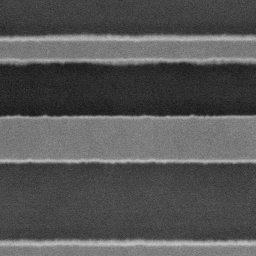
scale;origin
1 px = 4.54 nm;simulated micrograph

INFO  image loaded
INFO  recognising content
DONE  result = lines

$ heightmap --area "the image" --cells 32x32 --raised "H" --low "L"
LLLLLLLLLLLLLLLLLLLLLLLLLLLLLLLL
LLLLLLLLLLLLLLLLLLLLLLLLLLLLLLLL
LLLLLLLLLLLLLLLLLLLLLLLLLLLLLLLL
LLLLLLLLLLLLLLLLLLLLLLLLLLLLLLLL
LLLLLLLLLLLLLLLLLLLLLLLLLLLLLLLL
HHHHHHHHHHHHHHHHHHHHHHHHHHHHHHHH
HHHHHHHHHHHHHHHHHHHHHHHHHHHHHHHH
HHHHLHHHHLHHHHHHLLLLHHHLHHLLLLLH
LLLLLLLLLLLLLLLLLLLLLLLLLLLLLLLL
LLLLLLLLLLLLLLLLLLLLLLLLLLLLLLLL
LLLLLLLLLLLLLLLLLLLLLLLLLLLLLLLL
LLLLLLLLLLLLLLLLLLLLLLLLLLLLLLLL
LLLLLLLLLLLLLLLLLLLLLLLLLLLLLLLL
LLLLLLLLLLLLLLLLLLLLLLLLLLLLLLLL
LLLLLLLLLLLLLLLLLLLLLLLLLLLLLLLL
HHHHHHHHHHHHHHHHHHHHHHHHHHHHHHHH
HHHHHHHHHHHHHHHHHHHHHHHHHHHHHHHH
HHHHHHHHHHHHHHHHHHHHHHHHHHHHHHHH
HHHHHHHHHHHHHHHHHHHHHHHHHHHHHHHH
HHHHHHHHHHHHHHHHHHHHHHHHHHHHHHHH
LLLLLLLLLLLLLLLLLLLLLLLLLLLLLLLL
LLLLLLLLLLLLLLLLLLLLLLLLLLLLLLLL
LLLLLLLLLLLLLLLLLLLLLLLLLLLLLLLL
LLLLLLLLLLLLLLLLLLLLLLLLLLLLLLLL
LLLLLLLLLLLLLLLLLLLLLLLLLLLLLLLL
LLLLLLLLLLLLLLLLLLLLLLLLLLLLLLLL
LLLLLLLLLLLLLLLLLLLLLLLLLLLLLLLL
LLLLLLLLLLLLLLLLLLLLLLLLLLLLLLLL
LLLLLLLLLLLLLLLLLLLLLLLLLLLLLLLL
LLLLLLLLLLLLLLLLLLLLLLLLLLLLLLLL
HHHHHHHHHHHHHHHHHHHHHHHHHHHHHHHH
HHHHHHHHHHHHHHHHHHHHHHHHHHHHHHHH